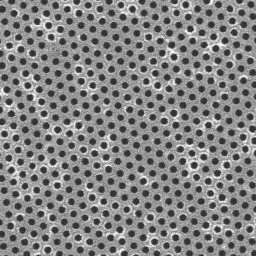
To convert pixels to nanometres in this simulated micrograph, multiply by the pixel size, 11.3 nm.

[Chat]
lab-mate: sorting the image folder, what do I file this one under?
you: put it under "a regular array of holes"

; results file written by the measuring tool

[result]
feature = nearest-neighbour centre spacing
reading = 136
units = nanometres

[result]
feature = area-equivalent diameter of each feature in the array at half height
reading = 7.23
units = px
